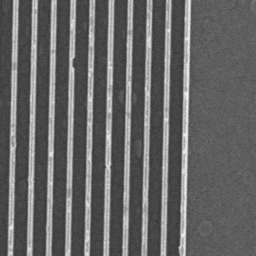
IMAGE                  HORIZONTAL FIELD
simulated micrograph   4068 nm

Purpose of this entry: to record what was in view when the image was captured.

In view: parallel lines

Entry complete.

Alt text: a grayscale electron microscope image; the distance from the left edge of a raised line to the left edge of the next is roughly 0.304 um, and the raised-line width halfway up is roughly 0.0695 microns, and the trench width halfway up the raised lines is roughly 230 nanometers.